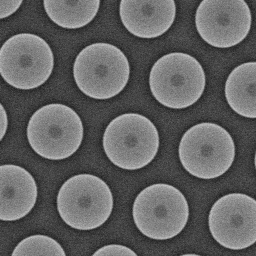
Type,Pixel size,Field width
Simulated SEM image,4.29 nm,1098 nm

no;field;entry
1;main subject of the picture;an array of small figures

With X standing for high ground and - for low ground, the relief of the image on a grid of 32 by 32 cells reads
XXX---XXXXXX---XXXXXXX---XXXXXX-
XX----XXXXXX---XXXXXXX---XXXXXX-
-------XXXX----XXXXXXX--XXXXXXX-
----------------XXXXX----XXXXXX-
--XX-------------XXX-----XXXXXX-
-XXXXX------X-------------XXXX--
XXXXXX----XXXXX-----------------
XXXXXXX--XXXXXXX----XXXX--------
XXXXXXX--XXXXXXX---XXXXXX-----XX
XXXXXX---XXXXXXX---XXXXXXX---XXX
-XXXX-----XXXXXX---XXXXXXX--XXXX
----------XXXXX----XXXXXX---XXXX
--------------------XXXXX---XXXX
-----XXXX--------------------XXX
X---XXXXXX-----XXX-------------X
X---XXXXXX----XXXXX------XX-----
X--XXXXXXX---XXXXXXX---XXXXX----
----XXXXXX---XXXXXXX---XXXXXX---
----XXXXXX---XXXXXXX--XXXXXXX---
-----XXXX----XXXXXX---XXXXXXX---
--------------XXXX-----XXXXXX---
XXX---------------------XXXX----
XXXX-----XXXX-------------------
XXXXX---XXXXXX----XXXX----------
XXXXX--XXXXXXX---XXXXXX-----XXX-
XXXX---XXXXXXX---XXXXXX----XXXXX
XXXX---XXXXXXX---XXXXXX---XXXXXX
-X------XXXXX----XXXXXX---XXXXXX
---------XXX-----XXXXXX---XXXXXX
----XX------------XXXX-----XXXXX
--XXXXX---------------------XXX-
--XXXXXX----XXXXX---------------